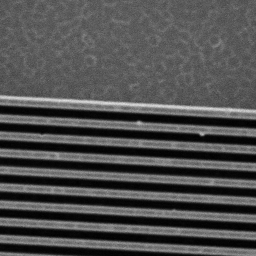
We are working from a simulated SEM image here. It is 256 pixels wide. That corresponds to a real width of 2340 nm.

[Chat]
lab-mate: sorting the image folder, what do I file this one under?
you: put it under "parallel lines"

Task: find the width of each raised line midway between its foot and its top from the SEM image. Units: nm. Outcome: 78.7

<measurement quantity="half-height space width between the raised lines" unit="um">0.0787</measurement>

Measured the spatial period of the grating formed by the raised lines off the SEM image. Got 157 nm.